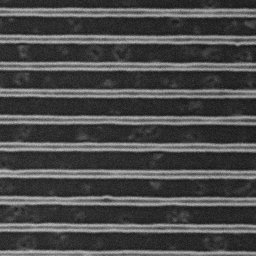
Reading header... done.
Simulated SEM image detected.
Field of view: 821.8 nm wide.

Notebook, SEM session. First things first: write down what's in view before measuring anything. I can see parallel lines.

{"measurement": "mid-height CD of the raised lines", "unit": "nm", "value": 21.6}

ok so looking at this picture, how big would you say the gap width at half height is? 0.0645 microns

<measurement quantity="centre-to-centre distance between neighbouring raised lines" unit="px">26.9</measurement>